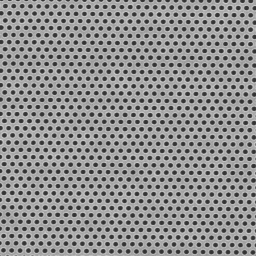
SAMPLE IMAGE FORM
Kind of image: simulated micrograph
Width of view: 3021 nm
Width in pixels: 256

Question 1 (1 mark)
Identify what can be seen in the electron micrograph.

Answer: a regular array of holes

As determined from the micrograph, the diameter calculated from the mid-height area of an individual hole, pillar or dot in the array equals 54.9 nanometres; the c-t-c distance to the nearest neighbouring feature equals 0.0956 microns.